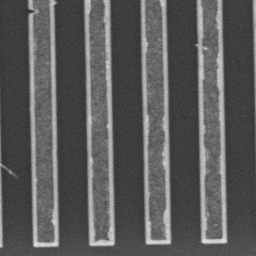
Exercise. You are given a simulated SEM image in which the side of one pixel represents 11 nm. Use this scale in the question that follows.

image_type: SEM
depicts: parallel lines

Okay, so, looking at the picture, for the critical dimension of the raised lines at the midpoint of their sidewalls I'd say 232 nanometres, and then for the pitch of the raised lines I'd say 616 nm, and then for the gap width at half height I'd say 35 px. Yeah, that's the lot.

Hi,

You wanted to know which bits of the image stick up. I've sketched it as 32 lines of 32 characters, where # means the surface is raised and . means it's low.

....###....##.....##.....##.....
....##.....##.....##.....##.....
....##.....##.....##.....###....
....##.....###....###....###....
....###....###....###....###....
....###....###....###....###....
....###....###....###....###....
....###....###....###....###....
....###....###....###....###....
....###....###....###....###....
....###....###....###....###....
....###....###....###....###....
....###....###....###....###....
....###....###....###....###....
....###....###....###....###....
....###....###....###....###....
....###....###....###....###....
....###....###....###....###....
....###....###....###....###....
....###....###....###....###....
....###....###....###....###....
....###....###....###....###....
....###....###....###....###....
....###....###....###....###....
....###....###....###....###....
....###....###....###....###....
....###....###....###....###....
....###....###....###....###....
....###....###....###.....##....
....###....###.....##.....##....
.....##.........................
................................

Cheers